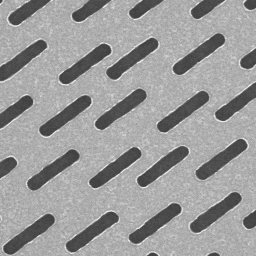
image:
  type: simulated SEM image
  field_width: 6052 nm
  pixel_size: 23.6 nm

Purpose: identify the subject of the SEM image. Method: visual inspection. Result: a regular array of holes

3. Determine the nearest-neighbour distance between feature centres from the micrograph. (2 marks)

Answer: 1.28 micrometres